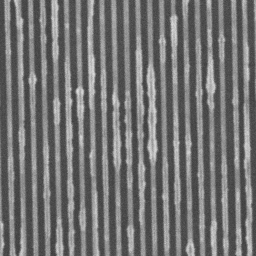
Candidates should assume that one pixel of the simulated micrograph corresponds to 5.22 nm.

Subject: parallel lines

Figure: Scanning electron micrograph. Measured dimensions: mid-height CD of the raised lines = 22.8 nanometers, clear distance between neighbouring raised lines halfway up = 36.6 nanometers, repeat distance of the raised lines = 62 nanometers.